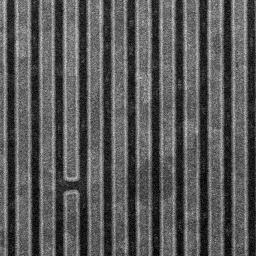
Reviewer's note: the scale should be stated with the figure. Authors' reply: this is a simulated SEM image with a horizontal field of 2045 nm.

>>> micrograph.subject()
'parallel lines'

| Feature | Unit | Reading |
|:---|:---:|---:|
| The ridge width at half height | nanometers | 112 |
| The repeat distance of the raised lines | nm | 192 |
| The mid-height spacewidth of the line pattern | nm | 81.9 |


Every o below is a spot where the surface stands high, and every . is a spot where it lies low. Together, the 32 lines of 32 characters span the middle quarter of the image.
ooo...ooo...ooo...ooo...oooo..oo
ooo...ooo...ooo...ooo...oooo..oo
ooo...ooo...ooo...ooo...oooo..oo
ooo...ooo...ooo...ooo...oooo..oo
ooo...ooo...ooo...ooo...oooo..oo
ooo...ooo...oooo..oooo..oooo..oo
ooo...ooo...ooo...oooo..oooo..oo
ooo...ooo...ooo...oooo..oooo..oo
ooo...ooo...ooo...oooo..oooo..oo
ooo...ooo...ooo...oooo..oooo..oo
ooo...ooo...ooo...oooo..oooo..oo
ooo...ooo...ooo...oooo..oooo..oo
ooo...ooo...ooo...oooo..oooo..oo
ooo...ooo...ooo...oooo..oooo..oo
ooo...ooo...ooo...oooo..oooo..oo
ooo...ooo...ooo...oooo..oooo..oo
ooo...ooo...ooo...oooo..oooo..oo
ooo...ooo...ooo...oooo..oooo..oo
ooo...ooo...ooo...oooo..oooo..oo
oooo..ooo...ooo...oooo..oooo..oo
oooo..ooo...ooo...oooo..oooo..oo
ooo...ooo...ooo...oooo..ooo...oo
ooo...ooo...ooo...oooo..oooo..oo
ooo...ooo...ooo...oooo..oooo..oo
ooo...ooo...ooo...oooo..oooo..oo
ooo...ooo...ooo...oooo..oooo..oo
ooo...ooo...ooo...oooo..oooo..oo
oooo..ooo...oooo..oooo..ooo...oo
oooo..ooo...oooo..oooo..oooo..oo
......ooo...oooo..oooo..oooo..oo
......ooo...oooo..oooo..oooo..oo
......ooo...oooo..oooo..oooo..oo